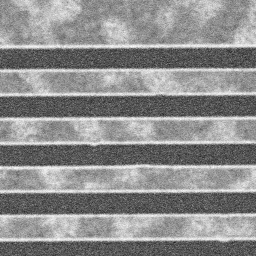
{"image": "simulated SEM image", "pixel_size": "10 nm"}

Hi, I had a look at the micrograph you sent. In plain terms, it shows parallel lines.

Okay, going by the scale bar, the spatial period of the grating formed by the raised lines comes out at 484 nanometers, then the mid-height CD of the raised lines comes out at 24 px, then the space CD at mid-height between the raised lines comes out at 241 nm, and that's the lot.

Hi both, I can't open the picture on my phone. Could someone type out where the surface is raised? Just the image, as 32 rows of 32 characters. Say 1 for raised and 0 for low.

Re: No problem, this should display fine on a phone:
11111111111111111111111111111111
11111111111111111111111111111111
11111111111111111111111111111111
11111111111111111111111111111111
11111111111111111111111111111111
11111111111111111111111111111111
00000000000000000000000000000000
00000000000000000000000000000000
00000000000000000000000000000000
11111111111111111111111111111111
11111111111111111111111111111111
11111111111111111111111111111111
00000000000000000000000000000000
00000000000000000000000000000000
00000000000000000000000000000000
11111111111111111111111111111111
11111111111111111111111111111111
11111111111111111111111111111111
00000000000000000000000000000000
00000000000000000000000000000000
00000000000000000000000000000000
11111111111111111111111111111111
11111111111111111111111111111111
11111111111111111111111111111111
00000000000000000000000000000000
00000000000000000000000000000000
00000000000000000000000000000000
11111111111111111111111111111111
11111111111111111111111111111111
11111111111111111111111111111111
00000000000000000000000000000000
00000000000000000000000000000000